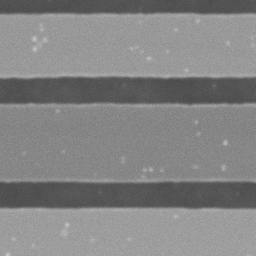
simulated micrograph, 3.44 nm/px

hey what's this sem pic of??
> lines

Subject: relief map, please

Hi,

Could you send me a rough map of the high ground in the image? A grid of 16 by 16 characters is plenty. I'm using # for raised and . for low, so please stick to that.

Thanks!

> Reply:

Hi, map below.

................
################
################
################
################
................
................
################
################
################
################
................
................
################
################
################